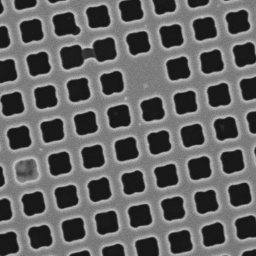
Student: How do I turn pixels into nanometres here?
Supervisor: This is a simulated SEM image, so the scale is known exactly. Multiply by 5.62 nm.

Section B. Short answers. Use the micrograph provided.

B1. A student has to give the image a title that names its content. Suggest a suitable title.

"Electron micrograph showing a regular array of holes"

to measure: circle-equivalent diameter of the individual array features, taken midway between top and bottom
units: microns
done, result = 0.134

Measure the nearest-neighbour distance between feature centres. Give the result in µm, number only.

0.19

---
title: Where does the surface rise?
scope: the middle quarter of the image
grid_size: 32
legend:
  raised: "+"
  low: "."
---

....++++++++++++++++++++++.....+
++++++++++++++++++++++++++.....+
+++++++++++...++++++++++++......
+++++++++......+++++++++++.....+
+.....+++......+++++++++++++++++
+.....+++......+++++++++++++++++
+.....+++......+++++++++++++++++
+......+++..++++++++++++++++....
+.....+++++++++++++++++.+++.....
+++++++++++++++++++......+++....
+++++++++++++...+++......+++....
+++++++++++.....+++......+++....
++++....+++.....++++.....++++.++
+++.....+++......+++.....+++++++
+++.....+++......+++++++++++++++
+++.....+++.....+++++++++++++++.
+++.....+++++++++++++++++++++...
+++...+++++++++++++++.....+++...
++++++++++++++++.++++.....++++..
+++++++++++++.....+++.....++++..
+++++++..++++.....+++......+++..
++++......+++.....+++.....++++++
.+++......+++......+++..++++++++
.+++......+++.....++++++++++++++
..+++.....+++++++++++++++++++++.
..+++....++++++++++++++++...+++.
..+++++++++++++++++++++.....+++.
+++++++++++++++.....+++.....+++.
+++++++++..+++......+++......+++
++++++.....+++......+++......+++
...+++.....++++.....++++..++++++
...+++......+++.....++++++++++++